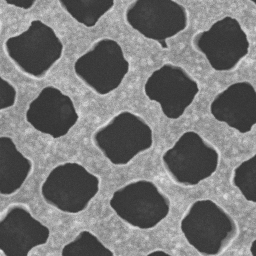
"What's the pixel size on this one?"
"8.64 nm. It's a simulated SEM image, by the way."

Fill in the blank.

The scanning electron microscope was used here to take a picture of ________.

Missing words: a regular array of holes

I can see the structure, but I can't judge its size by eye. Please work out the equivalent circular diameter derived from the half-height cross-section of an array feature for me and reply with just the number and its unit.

0.436 micrometres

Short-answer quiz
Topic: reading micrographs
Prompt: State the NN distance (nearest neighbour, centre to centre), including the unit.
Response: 0.583 micrometres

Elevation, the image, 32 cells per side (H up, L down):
HLLLHHHHLLLLLLHHLLLLLLHHHHHHHHHH
HHHHHHHHHLLLLHHHLLLLLLLHHHHHHHHH
HHHHHHHHHHLLHHHHLLLLLLLHHHHLLHHH
HHHHLLHHHHHHHHHHHLLLLLLHHHLLLLHH
HHLLLLLHHHHHHHHHHHLLLLHHHLLLLLLH
HLLLLLLLHHHHLLLHHHHHLHHHHLLLLLLH
HLLLLLLLHHHLLLLHHHHHHHHHHLLLLLLH
HHLLLLLHHHLLLLLLHHHHHHHHHHLLLLHH
HHHLLLHHHLLLLLLLHHHHLLLHHHHLLHHH
HHHHLHHHHHLLLLLLHHHLLLLHHHHHHHHH
LHHHHHHHHHHLLLLHHHLLLLLLLHHHHLLH
LLHHHLLLHHHHLLHHHHLLLLLLLHHHLLLL
LLHHLLLLLHHHHHHHHHHLLLLLHHHLLLLL
LHHHLLLLLHHHHHHHHHHHLLLHHHLLLLLL
HHHLLLLLLLHHHHHLLHHHHLLHHHHLLLLL
HHHHLLLLLHHHHLLLLLHHHHHHHHHHLLLL
HHHHHLLLHHHHLLLLLLLHHHHLHHHHHHLH
LHHHHHHHHHHHLLLLLLLHHHLLLHHHHHHH
LLHHHHHHHHHHLLLLLLLHHLLLLLLHHHHH
LLLHHHHHHHHHHLLLLHHHLLLLLLLHHHHH
LLLLHHHHLLHHHHLLHHHHHLLLLLLHHHLL
LLLLHHLLLLLHHHHHHHHHHLLLLLLHHLLL
LLLHHHLLLLLLHHHHHHHHHHLLLHHHHLLL
LLHHHLLLLLLLHHHLLLLLHHHHHHHHHHLL
HHHHHLLLLLLLHHLLLLLLHHHHHHHHHHLL
HHHHHHLLLLLHHHLLLLLLLHHHLLLHHHHH
HLLHHHHHLLHHHHLLLLLLLHHHLLLLHHHH
LLLLLHHHHHHHHHHHLLLLHHHLLLLLLHHH
LLLLLLHHHHHHHHHHHHLHHHHLLLLLLHHH
LLLLLLHHHHLLHHHHHHHHHHHLLLLLLHHH
LLLLLHHHLLLLLHHHHHHHHHHHLLLLHHHH
LLLLHHHHLLLLLLHHHHHLLHHHHLLHHHHL